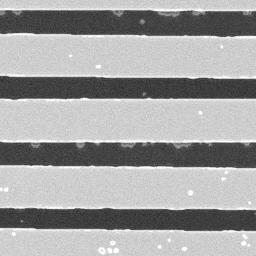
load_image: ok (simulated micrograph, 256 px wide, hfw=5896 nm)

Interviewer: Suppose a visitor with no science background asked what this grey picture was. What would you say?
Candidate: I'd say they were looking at lines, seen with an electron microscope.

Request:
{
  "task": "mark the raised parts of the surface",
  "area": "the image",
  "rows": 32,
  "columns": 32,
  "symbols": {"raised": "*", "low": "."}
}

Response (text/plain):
********************************
................................
................................
................................
*******************....*........
********************************
********************************
********************************
********************************
.*******************************
................................
................................
********************************
********************************
********************************
********************************
********************************
********************************
................................
................................
................................
********************************
********************************
********************************
********************************
********************************
................................
................................
................................
********************************
********************************
********************************